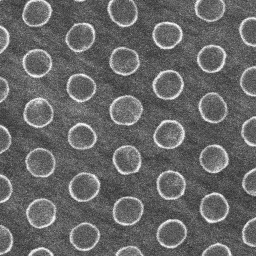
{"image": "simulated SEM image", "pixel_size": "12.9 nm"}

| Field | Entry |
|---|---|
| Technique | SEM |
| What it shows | a regular array of raised bodies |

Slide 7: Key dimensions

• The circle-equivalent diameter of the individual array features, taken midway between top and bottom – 365 nm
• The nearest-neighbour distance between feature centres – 0.634 microns